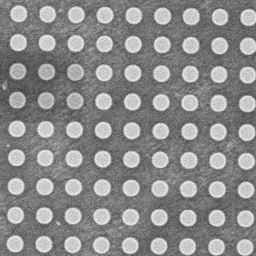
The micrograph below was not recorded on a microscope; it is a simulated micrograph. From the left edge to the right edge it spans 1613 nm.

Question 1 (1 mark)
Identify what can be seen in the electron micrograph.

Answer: an array of small figures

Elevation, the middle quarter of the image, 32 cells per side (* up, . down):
..**.....**.....**..............
.****...****...****....***....**
.****...****...****....***....**
..**.....**.....***....***....**
................................
................................
................................
..*.............................
.***....****...****....***....**
.****...****...****...****....**
.***....***....****....***....**
...............................*
................................
................................
................................
.***....****...****....***....**
.***....****...****...****....**
.***....***....****...****....**
................**.....**.....**
................................
................................
................................
.***....***.....**.....**.....**
.***....****...****...****...***
.***....****...****...****...***
..*......**.....**.....**.....**
................................
................................
................................
.***....***.....**.....**.....**
****....***....****...****...***
.***....***....****...****...***